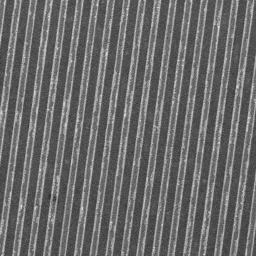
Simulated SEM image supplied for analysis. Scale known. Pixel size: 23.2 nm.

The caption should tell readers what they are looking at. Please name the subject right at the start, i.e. parallel lines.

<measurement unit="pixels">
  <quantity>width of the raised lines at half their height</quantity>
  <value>5.95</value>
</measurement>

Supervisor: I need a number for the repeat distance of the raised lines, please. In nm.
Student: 357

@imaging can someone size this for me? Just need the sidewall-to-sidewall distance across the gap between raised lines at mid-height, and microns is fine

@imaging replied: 0.215